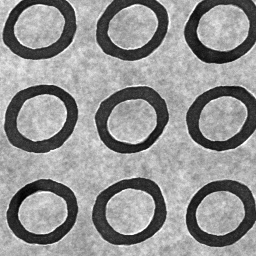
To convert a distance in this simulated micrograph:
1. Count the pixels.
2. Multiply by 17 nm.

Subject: ring-shaped grooves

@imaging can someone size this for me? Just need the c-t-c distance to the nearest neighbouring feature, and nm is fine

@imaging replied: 1510